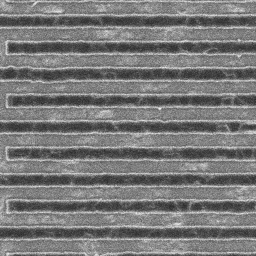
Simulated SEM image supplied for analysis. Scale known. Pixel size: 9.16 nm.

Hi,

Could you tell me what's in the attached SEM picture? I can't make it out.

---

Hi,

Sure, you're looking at parallel lines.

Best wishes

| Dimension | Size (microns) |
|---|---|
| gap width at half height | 0.115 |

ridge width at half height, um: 0.122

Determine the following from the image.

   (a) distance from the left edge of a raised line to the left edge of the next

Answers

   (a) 242 nanometers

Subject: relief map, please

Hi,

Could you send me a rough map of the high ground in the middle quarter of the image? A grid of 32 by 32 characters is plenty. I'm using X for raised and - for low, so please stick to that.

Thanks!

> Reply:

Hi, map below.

--------------------------------
XXXXXXXXXXXXXXXXXXXXXXXXXXXXXXXX
XXXXXXXXXXXXXXXXXXXXXXXXXXXXXXXX
XXXXXXXXXXXXXXXXXXXXXXXXXXXXXXXX
--------------------------------
--------------------------------
--------------------------------
X-XX--XXX-----------------------
XXXXXXXXXXXXXXXXXXXXXXXXXXXXXXXX
XXXXXXXXXXXXXXXXXXXXXXXXXXXXXXXX
XXXXXXXXXXXXXXXXXXXXXXXXXXXXXXXX
--------------------------------
---------XX---------------------
--------------------------------
XXXXXXXXXXXXXXXXXXXXXXXXXXXXXXXX
XXXXXXXXXXXXXXXXXXXXXXXXXXXXXXXX
XXXXXXXXXXXXXXXXXXXXXXXXXXXXXXXX
X-----------------X---------X---
--------------------------------
--------------------------------
--------------------------------
XXXXXXXXXXXXXXXXXXXXXXXXXXXXXXXX
XXXXXXXXXXXXXXXXXXXXXXXXXXXXXXXX
XXXXXXXXXXXXXXXXXXXXXXXXXXXXXXXX
--------------------------------
--------------------------------
--------------------------------
XXXXXXX-XXXXXXXXXXXXXXXXXXXXXXXX
XXXXXXXXXXXXXXXXXXXXXXXXXXXXXXXX
XXXXXXXXXXXXXXXXXXXXXXXXXXXXXXXX
---XXXXXX--X-XXXXXXXXXXX-XXXXXXX
--------------------------------